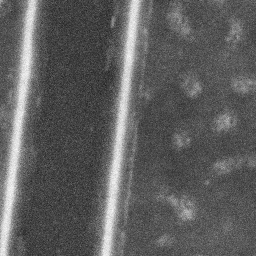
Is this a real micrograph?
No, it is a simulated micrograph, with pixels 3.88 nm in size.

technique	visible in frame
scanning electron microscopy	one or a few lines or trenches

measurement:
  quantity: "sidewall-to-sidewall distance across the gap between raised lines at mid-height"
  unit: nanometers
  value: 392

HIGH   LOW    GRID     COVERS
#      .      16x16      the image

##......########
##......########
##......########
##......########
##......########
#.......########
#.......########
#.......########
#......#########
#......#########
#......#########
#......#########
#......#########
.......#########
.......#########
.......#########